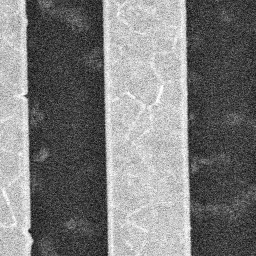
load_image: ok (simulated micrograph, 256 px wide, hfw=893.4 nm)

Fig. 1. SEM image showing one or a few lines or trenches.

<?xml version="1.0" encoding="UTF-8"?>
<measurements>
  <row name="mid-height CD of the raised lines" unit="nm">272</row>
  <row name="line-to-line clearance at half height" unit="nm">285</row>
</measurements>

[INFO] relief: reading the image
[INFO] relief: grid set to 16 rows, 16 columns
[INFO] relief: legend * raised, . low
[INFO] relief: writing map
*......****.....
**.....****.....
*......****.....
**.....****.....
**.....****.....
**.....*****....
**.....*****....
**.....*****....
**.....*****....
**.....*****....
**.....*****....
**.....*****....
**.....*****....
**.....*****....
**.....*****....
**.....*****....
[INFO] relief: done